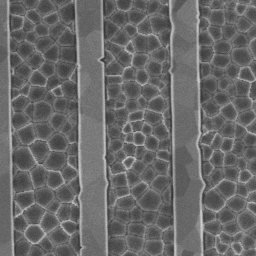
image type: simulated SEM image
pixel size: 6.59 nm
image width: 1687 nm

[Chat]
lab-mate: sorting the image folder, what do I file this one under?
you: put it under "one or a few lines or trenches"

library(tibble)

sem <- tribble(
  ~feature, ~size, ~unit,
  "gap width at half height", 447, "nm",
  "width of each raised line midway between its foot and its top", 0.175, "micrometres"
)